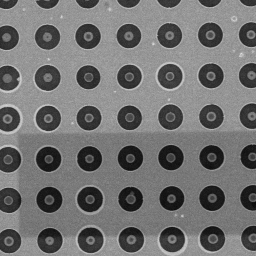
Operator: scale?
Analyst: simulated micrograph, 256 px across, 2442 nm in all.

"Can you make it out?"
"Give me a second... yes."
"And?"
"an array of small figures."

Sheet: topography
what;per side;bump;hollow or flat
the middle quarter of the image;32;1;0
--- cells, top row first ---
11111001111111100011111100001111
11110000111111000001111100000111
11100010011110001000111000100011
11100110011110011000111000100011
11100000011110000001111100000011
11110000111111000001111100000111
11111101111111111111111111011111
11111111111111111111111111111111
11111111111111111111111111111111
11111111111111111111111111111111
11111100111111100111111110001111
11110000011111000001111100000111
11100000011110001001111100100011
11100110011110011000111000110011
11100000011110000001111100000011
11110000011111000001111100000111
11111101111111100111111111111111
11111111111111111111111111111111
11111111111111111111111111111111
11111111111111111111111111111111
11111101111111110011111110001111
11110000011111000001111100000111
11100000011111000000111100100011
11100010001110001100111100110011
11100000001111001000111100000011
11110000011111000001111100000111
11111000111111100011111111001111
11111111111111111111111111111111
11111111111111111111111111111111
11111111111111111111111111111111
11111101111111111111111111001111
11110000011111100001111110000111